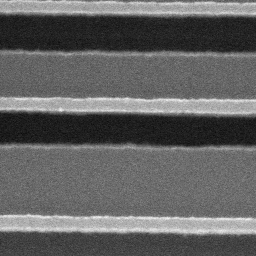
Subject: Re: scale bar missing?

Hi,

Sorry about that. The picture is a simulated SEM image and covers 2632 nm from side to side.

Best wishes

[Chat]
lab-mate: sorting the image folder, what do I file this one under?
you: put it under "lines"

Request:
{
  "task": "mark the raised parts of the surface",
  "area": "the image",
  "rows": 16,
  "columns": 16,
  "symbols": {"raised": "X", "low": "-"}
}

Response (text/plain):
XXXXXXXXXXXXXXXX
----------------
----------------
XXXXXXXXXXXXXXXX
XXXXXXXXXXXXXXXX
XXXXXXXXXXXXXXXX
XXXXXXXXXXXXXXXX
----------------
----------------
XXXXXXXXXXXXXXXX
XXXXXXXXXXXXXXXX
XXXXXXXXXXXXXXXX
XXXXXXXXXXXXXXXX
XXXXXXXXXXXXXXXX
----------------
----------------